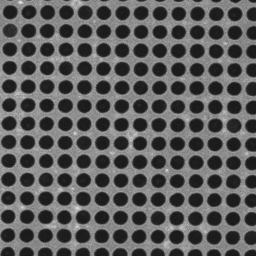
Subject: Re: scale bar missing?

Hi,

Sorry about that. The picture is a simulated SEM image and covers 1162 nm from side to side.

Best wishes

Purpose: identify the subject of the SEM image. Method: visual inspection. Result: a regular array of holes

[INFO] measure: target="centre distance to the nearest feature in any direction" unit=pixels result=18.3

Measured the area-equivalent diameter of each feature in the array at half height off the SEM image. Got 66.8 nm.